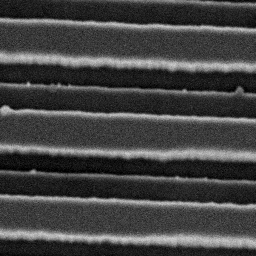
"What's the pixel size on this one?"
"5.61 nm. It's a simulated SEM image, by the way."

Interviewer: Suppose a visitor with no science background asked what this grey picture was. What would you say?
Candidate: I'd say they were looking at lines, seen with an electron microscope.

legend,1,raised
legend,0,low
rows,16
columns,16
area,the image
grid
0000000000000000
1111111100000000
1111111111111111
1111111111111111
0000000000000000
0000000000000000
0000000000000000
1111111111111111
1111111111111111
0001111111111111
0000000000000000
0000000000000000
1111111100000000
1111111111111111
1111111111111111
0000000000000000